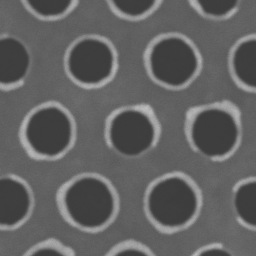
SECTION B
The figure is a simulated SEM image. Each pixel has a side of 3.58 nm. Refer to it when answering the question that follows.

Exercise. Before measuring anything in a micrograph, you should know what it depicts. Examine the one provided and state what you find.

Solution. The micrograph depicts holes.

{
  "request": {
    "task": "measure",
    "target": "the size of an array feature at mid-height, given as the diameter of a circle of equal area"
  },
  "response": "45.6 pixels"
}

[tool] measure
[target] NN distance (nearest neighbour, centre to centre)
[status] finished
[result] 291 nm